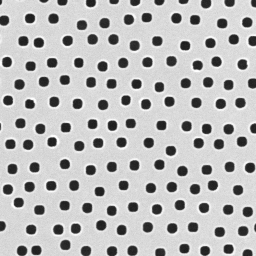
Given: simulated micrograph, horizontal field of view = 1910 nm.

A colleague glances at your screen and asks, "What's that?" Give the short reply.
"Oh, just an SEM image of a regular array of holes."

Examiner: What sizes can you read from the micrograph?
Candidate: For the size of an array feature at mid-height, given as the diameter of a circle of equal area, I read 11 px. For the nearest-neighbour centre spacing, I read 148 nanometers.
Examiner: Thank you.